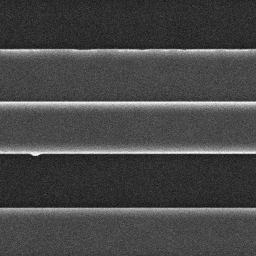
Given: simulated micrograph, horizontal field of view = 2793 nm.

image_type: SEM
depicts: lines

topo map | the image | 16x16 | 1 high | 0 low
0000000000000000
0000000000000000
0000000000000000
1111111111111111
1111111111111111
1111111111111111
1111111111111111
1111111111111111
1111111111111111
1111111111111111
0000000000000000
0000000000000000
0000000000000000
1111111111111111
1111111111111111
1111111111111111